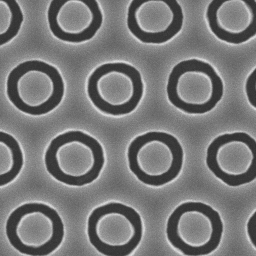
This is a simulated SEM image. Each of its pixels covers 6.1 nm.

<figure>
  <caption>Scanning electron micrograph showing ring-shaped grooves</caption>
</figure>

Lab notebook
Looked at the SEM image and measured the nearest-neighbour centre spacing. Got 488 nm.